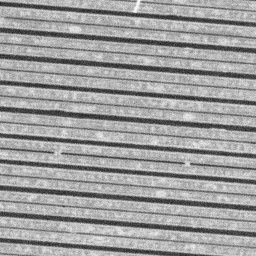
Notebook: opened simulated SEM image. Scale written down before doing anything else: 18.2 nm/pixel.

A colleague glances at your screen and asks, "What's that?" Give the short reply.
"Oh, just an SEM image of parallel lines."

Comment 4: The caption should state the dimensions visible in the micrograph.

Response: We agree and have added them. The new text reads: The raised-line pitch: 0.238 um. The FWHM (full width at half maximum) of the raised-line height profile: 0.162 µm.